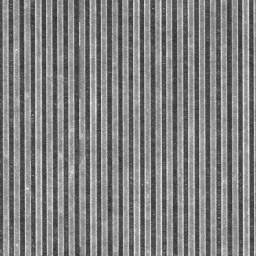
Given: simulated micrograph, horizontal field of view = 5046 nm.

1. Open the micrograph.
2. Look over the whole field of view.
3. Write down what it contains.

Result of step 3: parallel lines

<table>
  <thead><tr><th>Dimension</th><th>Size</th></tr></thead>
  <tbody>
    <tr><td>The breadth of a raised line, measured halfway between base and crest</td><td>104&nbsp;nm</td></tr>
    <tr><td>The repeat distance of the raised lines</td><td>215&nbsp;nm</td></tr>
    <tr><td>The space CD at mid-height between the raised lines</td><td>104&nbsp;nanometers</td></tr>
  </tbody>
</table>